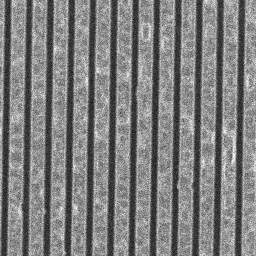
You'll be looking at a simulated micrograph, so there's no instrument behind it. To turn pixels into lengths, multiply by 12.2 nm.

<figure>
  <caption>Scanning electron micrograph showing parallel lines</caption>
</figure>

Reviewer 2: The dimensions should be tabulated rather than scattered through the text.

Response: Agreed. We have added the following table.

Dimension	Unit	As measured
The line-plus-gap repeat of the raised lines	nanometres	259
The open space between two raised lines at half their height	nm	82.2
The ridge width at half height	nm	175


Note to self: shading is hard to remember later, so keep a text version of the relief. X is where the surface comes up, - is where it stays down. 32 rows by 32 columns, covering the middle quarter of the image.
X--XXX--XXX--XXXX--XXX--XXX--XXX
X--XXX--XXX--XXXX--XXX--XXX--XXX
X--XXX--XXX--XXXX--XXX--XXX--XXX
X--XXX--XXX--XXXX--XXX--XXX--XXX
X--XXX--XXX--XXXX--XXX--XXX--XXX
X--XXX--XXX--XXXX-XXXX--XXX--XXX
X--XXX--XXX--XXXX-XXXX--XXX--XXX
X--XXX--XXX--XXXX-XXXX--XXX--XXX
X--XXX--XXX--XXXX-XXXX--XXX--XXX
X--XXX--XXX--XXXX-XXXX--XXX--XXX
---XXX--XXX--XXXX-XXXX--XXX--XXX
---XXX--XXX--XXXX-XXXX--XXX--XXX
---XXX--XXX--XXXX-XXXX--XXX--XXX
---XXX--XXX--XXX--XXXX--XXX--XXX
---XXX--XXX--XXX--XXXX--XXX--XXX
---XXX--XXX--XXX--XXXX--XXX--XXX
---XXX--XXX--XXX--XXXX--XXX--XXX
---XXX--XXX--XXX--XXXX--XXX--XXX
---XXX--XXX--XXX--XXXX--XXX--XXX
--XXXX--XXX--XXX--XXXX--XXX--XXX
--XXXX--XXX--XXX--XXXX--XXX--XXX
--XXXX--XXX--XXX--XXXX--XXX--XXX
--XXXX--XXX--XXX--XXXX--XXX--XXX
--XXXX--XXX--XXX--XXXX--XXX--XXX
--XXXX--XXX--XXX--XXXX--XXX--XXX
--XXXX--XXX--XXX--XXXX--XXX--XXX
--XXXX--XXX--XXX--XXXX--XXX--XXX
--XXXX--XXX--XXX--XXXX-XXXX--XXX
--XXX---XXX--XXX--XXXX-XXXX--XXX
--XXX---XXX--XXX--XXXX-XXXX--XXX
--XXX---XXX--XXX--XXXX-XXXX--XXX
--XXX---XXX--XXX--XXX--XXXX--XXX